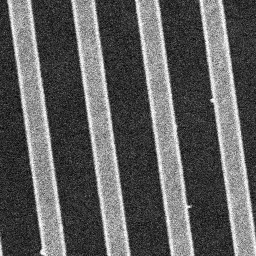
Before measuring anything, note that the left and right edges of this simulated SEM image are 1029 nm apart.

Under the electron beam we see parallel lines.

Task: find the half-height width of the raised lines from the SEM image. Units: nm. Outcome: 86.7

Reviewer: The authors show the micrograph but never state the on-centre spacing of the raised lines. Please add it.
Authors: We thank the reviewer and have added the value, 255 nm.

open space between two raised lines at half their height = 0.17 microns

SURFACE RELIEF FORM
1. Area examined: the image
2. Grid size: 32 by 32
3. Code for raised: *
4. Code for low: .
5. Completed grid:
.***.....***.....***.....***....
.***.....***.....***.....***....
.***.....***.....***.....***....
..**.....***.....***......**....
..**......**......**......**....
..**......**......**......**....
..***.....***.....***.....***...
..***.....***.....***.....***...
..***.....***.....***.....***...
..***.....***.....***.....***...
...**.....***.....***......**...
...**......**......**......**...
...**......**......**......**...
...***.....***.....***.....***..
...***.....***.....***.....***..
...***.....***.....***.....***..
...***.....***.....***.....***..
...***.....***.....***.....***..
....**......**......**......**..
....**......**......**......**..
....***.....***.....***.....***.
....***.....***.....***.....***.
....***.....***.....***.....***.
....***.....***.....***.....***.
....***.....***.....***.....***.
.....**......**......**......**.
.....**......**......**......**.
.....***.....***.....***.....***
.....***.....***.....***.....***
.....***.....***.....***.....***
.....***.....***.....***.....***
.....***.....***.....***.....***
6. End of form